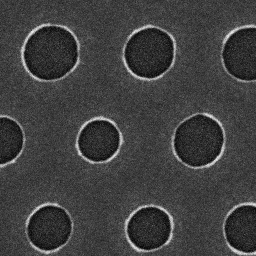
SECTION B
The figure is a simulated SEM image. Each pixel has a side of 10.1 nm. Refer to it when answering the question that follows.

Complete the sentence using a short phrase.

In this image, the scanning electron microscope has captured holes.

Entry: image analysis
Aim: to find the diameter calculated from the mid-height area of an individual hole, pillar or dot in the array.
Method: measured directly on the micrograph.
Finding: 484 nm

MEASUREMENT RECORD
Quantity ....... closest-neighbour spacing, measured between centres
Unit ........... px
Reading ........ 100